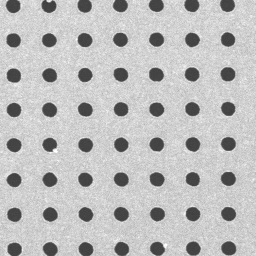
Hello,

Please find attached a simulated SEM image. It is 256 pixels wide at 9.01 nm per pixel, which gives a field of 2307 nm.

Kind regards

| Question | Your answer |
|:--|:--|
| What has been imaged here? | a regular array of holes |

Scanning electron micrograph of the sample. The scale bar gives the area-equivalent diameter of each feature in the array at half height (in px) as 14.7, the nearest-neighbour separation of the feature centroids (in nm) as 313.